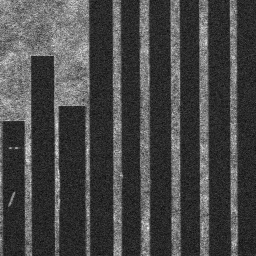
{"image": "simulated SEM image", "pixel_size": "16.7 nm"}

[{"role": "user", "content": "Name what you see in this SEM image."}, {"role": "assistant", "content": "parallel lines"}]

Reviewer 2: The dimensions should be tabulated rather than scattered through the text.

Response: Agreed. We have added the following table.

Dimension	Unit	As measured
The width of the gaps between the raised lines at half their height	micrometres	0.131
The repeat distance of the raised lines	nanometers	491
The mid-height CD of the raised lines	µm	0.38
